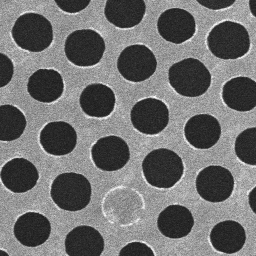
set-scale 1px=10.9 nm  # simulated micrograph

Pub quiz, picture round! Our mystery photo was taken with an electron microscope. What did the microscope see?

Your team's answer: a regular array of holes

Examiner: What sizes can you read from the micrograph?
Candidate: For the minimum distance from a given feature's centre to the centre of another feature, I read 587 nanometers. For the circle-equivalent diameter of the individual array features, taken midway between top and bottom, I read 404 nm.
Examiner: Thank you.